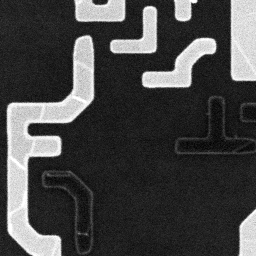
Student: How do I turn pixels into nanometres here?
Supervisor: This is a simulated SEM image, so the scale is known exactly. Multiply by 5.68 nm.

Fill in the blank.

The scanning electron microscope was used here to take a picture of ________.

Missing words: wiring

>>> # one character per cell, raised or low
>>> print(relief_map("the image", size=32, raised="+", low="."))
.........+++.++.......++.....+++
..........+++++...+...++.....+++
..........+++++...+..........+++
..................+..........+++
..................+..........+++
.........+++..+++++.....+++..+++
.........+++..+++++....++++..+++
.........+++..........+++....+++
.........+++..........++.....+++
.........+++......++++++.....+++
.........+++......++++++........
.........+++....................
........+++...............++....
.++++++++++...............++..++
.+++++++++................++..++
.+++......................++....
.++.......................++....
.+++++++..............++++++++++
.+++++++..............++++++++++
.+++............................
.++.............................
.++...+++.......................
.++..+++++......................
.++.....+++.....................
.++......+++....................
.++......+++....................
.++.......+.....................
.++......++....................+
.+++.....+++..................++
.+++++...+++..................++
..++++++..++..................++
...+++++..+...................++